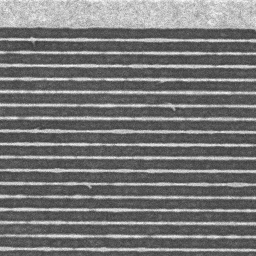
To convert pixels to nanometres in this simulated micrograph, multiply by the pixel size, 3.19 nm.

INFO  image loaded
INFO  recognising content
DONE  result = parallel lines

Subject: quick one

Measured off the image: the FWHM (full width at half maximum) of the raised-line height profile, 2.76 px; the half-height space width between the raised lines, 31.9 nm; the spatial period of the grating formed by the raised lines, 41.8 nm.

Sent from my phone